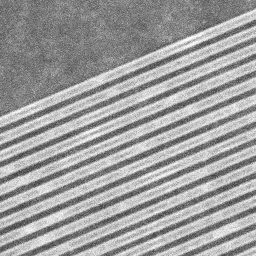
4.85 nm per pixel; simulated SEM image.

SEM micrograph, parallel lines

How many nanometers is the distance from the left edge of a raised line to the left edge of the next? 75.7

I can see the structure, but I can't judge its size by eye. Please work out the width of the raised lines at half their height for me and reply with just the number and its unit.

40.8 nanometers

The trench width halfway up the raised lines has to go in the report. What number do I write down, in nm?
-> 36.2